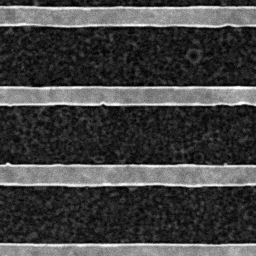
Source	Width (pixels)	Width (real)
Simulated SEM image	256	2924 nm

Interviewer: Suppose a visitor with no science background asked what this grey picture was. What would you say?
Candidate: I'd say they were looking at one or a few lines or trenches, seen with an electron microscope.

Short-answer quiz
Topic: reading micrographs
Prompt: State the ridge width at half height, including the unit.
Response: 210 nm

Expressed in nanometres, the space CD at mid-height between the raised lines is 697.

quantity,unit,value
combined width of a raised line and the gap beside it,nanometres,904